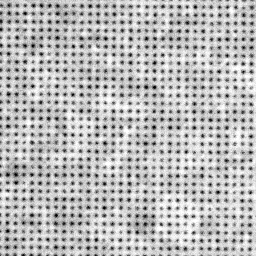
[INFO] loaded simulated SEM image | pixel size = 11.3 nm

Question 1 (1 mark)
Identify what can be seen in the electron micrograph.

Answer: a regular array of holes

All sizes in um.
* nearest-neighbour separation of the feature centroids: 0.0851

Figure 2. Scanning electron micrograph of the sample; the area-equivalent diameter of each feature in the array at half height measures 3.57 px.